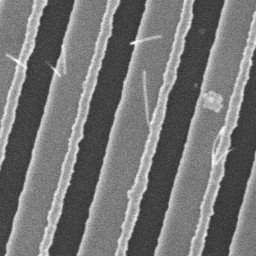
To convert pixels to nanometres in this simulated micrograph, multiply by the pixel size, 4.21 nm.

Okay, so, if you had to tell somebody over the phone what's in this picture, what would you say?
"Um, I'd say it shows lines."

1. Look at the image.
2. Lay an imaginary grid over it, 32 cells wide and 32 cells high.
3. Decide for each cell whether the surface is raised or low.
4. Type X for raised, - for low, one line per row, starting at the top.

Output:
XXXXXX---XXXXXX---XXXXXX----XXXX
XXXXX----XXXXX----XXXXXX----XXXX
XXXXX----XXXXX----XXXXXX---XXXXX
XXXXX---XXXXXX---XXXXXXX---XXXXX
XXXX----XXXXXX---XXXXXX----XXXXX
XXXX----XXXXX----XXXXXX----XXXXX
XXXX----XXXXX----XXXXXX---XXXXXX
XXX----XXXXXX---XXXXXX----XXXXX-
XXX----XXXXXX---XXXXXX----XXXXX-
XXX----XXXXX----XXXXXX---XXXXXX-
XXX---XXXXXX---XXXXXXX---XXXXXX-
XXX---XXXXXX---XXXXXX----XXXXX--
XX----XXXXX----XXXXXX----XXXXX--
XX----XXXXX----XXXXXX----XXXXX--
XX---XXXXXX---XXXXXXX---XXXXXX--
XX---XXXXX----XXXXXX----XXXXXX--
X----XXXXX----XXXXXX----XXXXX---
X---XXXXXX----XXXXXX---XXXXXX---
X---XXXXXX---XXXXXX----XXXXXX---
X---XXXXX----XXXXXX----XXXXX----
----XXXXX----XXXXXX---XXXXXX----
---XXXXXX----XXXXXX---XXXXXX---X
---XXXXXX---XXXXXX----XXXXXX---X
---XXXXX----XXXXXX----XXXXX----X
---XXXXX----XXXXXX---XXXXXX----X
--XXXXXX---XXXXXX----XXXXXX---XX
--XXXXXX---XXXXXX----XXXXXX---XX
--XXXXX----XXXXXX----XXXXX----XX
--XXXXX----XXXXXX---XXXXXX----XX
-XXXXXX---XXXXXX----XXXXXX---XXX
-XXXXX----XXXXXX----XXXXX----XXX
-XXXXX----XXXXXX---XXXXXX----XXX